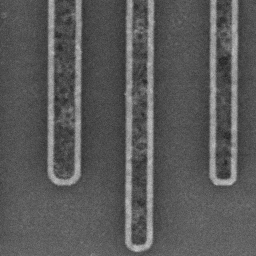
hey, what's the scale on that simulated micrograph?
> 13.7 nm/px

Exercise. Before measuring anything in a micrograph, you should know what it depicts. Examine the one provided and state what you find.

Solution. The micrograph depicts one or a few lines or trenches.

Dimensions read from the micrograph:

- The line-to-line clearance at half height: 809 nm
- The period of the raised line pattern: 1090 nanometres